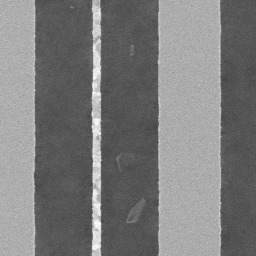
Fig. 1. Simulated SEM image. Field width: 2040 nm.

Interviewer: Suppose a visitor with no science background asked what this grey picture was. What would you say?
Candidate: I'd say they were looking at lines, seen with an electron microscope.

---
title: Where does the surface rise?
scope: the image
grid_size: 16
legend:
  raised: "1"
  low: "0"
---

1100000000111100
1100000000111100
1100000000111100
1100000000111100
1100000000111100
1100000000111100
1100000000111100
1100000000111100
1100000000111100
1100000000111100
1100000000111100
1100000000111100
1100000000111100
1100000010111100
1100000000111100
1100000000111100